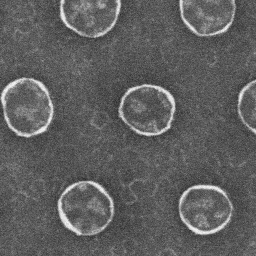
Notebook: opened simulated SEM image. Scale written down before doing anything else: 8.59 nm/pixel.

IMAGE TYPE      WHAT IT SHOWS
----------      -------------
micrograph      raised bodies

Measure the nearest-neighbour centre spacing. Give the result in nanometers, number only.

991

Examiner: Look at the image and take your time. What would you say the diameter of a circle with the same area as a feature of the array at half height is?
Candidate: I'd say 447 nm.